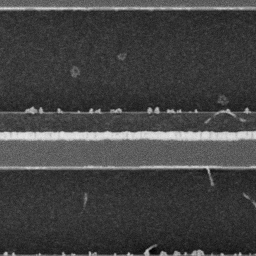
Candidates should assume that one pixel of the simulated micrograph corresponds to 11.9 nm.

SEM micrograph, lines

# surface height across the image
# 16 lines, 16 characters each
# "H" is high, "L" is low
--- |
HHHHHHLHHHHHLHHH
LLLLLLLLLLLLLLLL
LLLLLLLLLLLLLLLL
LLLLLLLLLLLLLLLL
LLLLLLLLLLLLLLLL
LLLLLLLLLLLLLLLL
LLLLLLLLLLLLLLLL
LLLLLLLLLLLLLLLL
HHHHHHHHHHHHHHHH
HHHHHHHHHHHHHHHH
LHHLLLLLLLLLHHLL
LLLLLLLLLLLLLLLL
LLLLLLLLLLLLLLLL
LLLLLLLLLLLLLLLL
LLLLLLLLLLLLLLLL
LLLLLLLLLLLLLLLL